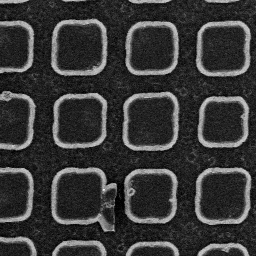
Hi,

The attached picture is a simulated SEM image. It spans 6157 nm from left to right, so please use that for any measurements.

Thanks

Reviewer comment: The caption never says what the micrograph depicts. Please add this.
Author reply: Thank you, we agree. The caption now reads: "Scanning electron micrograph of a regular array of raised bodies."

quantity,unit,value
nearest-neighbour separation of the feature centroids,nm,1710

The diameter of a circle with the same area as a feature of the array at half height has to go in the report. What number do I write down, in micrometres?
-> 1.31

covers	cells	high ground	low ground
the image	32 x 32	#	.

................................
................................
................................
####...######....#####...######.
####...######...######...######.
####...######...######...######.
####...######...######...######.
####...######...######...######.
###....#####....#####....######.
................................
................................
................................
####....#####...######....####..
####...######...######...######.
####...######...######...######.
####...######...######...######.
####...######...######...######.
####...######...######...#####..
.................#..............
................................
................................
###.....####......###.....#####.
####...######...######...######.
####...########.######...######.
####...########.######...######.
####...#######..######...######.
####...#######..######...######.
##.....#######...####....#####..
.............#..................
................................
####....####......#.............
####...######...######...######.